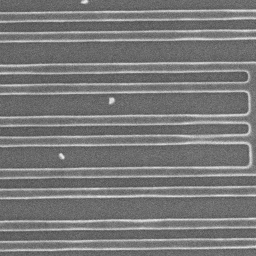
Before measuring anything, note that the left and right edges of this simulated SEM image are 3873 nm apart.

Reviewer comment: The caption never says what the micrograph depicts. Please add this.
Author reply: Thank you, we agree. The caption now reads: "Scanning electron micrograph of groups of lines, slits or small figures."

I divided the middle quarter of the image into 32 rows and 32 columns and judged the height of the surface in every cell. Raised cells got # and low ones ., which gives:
################################
################################
................................
................................
................................
################################
################################
................................
................................
................................
................................
................................
................................
################################
################################
................................
................................
................................
################################
################################
................................
................................
................................
................................
................................
................................
################################
################################
................................
................................
................................
################################